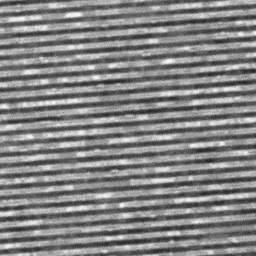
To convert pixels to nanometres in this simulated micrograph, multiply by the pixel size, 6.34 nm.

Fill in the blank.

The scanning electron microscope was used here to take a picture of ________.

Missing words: parallel lines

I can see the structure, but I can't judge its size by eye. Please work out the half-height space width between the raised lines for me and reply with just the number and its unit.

38.7 nanometres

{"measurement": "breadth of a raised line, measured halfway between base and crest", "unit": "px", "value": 4.37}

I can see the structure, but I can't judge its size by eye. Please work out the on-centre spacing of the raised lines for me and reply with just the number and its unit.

0.0682 microns